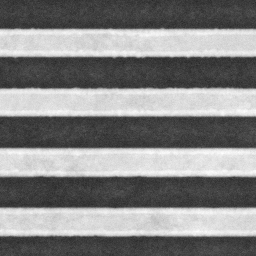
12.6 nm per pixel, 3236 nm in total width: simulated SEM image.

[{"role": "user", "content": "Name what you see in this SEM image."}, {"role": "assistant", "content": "lines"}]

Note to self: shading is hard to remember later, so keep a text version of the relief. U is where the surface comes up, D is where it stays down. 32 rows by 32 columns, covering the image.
DDDDDDDDDDDDDDDDDDDDDDDDDDDDDDDD
DDDDDDDDDDDDDDDDDDDDDDDDDDDDDDDD
DDDDDDDDDDDDDDDDDDDDDDDDDDDDDDDD
DDDDDDDDDDDDDDDDDDDDDDDDDDDDDDDD
UUUUUUUUUUUUUUUUUUUUUUUUUUUUUUUU
UUUUUUUUUUUUUUUUUUUUUUUUUUUUUUUU
UUUUUUUUUUUUUUUUUUUUUUUUUUUUUUUU
DDDDDDDDDDDDDDDDDDDDDDDDDDDDDDDD
DDDDDDDDDDDDDDDDDDDDDDDDDDDDDDDD
DDDDDDDDDDDDDDDDDDDDDDDDDDDDDDDD
DDDDDDDDDDDDDDDDDDDDDDDDDDDDDDDD
UUUUUUUUUUUUUUUUUUUUUUUUUUUUUUUU
UUUUUUUUUUUUUUUUUUUUUUUUUUUUUUUU
UUUUUUUUUUUUUUUUUUUUUUUUUUUUUUUU
DDDDDDDDDDDDDDDDDDDDDDDDDDDDDDDD
DDDDDDDDDDDDDDDDDDDDDDDDDDDDDDDD
DDDDDDDDDDDDDDDDDDDDDDDDDDDDDDDD
DDDDDDDDDDDDDDDDDDDDDDDDDDDDDDDD
DDDDDDDDDDDDDDDDDDDDDDDDDDDDDDDD
UUUUUUUUUUUUUUUUUUUUUUUUUUUUUUUU
UUUUUUUUUUUUUUUUUUUUUUUUUUUUUUUU
UUUUUUUUUUUUUUUUUUUUUUUUUUUUUUUU
DDDDDDDDDDDDDDDDDDDDDDDDDDDDDDDD
DDDDDDDDDDDDDDDDDDDDDDDDDDDDDDDD
DDDDDDDDDDDDDDDDDDDDDDDDDDDDDDDD
DDDDDDDDDDDDDDDDDDDDDDDDDDDDDDDD
UUUUUUUUUUUUUUUUUUUUUUUUUUUUUUUU
UUUUUUUUUUUUUUUUUUUUUUUUUUUUUUUU
UUUUUUUUUUUUUUUUUUUUUUUUUUUUUUUU
DDDDDDDDDDDDDDDDDDDDDDDDDDDDDDDD
DDDDDDDDDDDDDDDDDDDDDDDDDDDDDDDD
DDDDDDDDDDDDDDDDDDDDDDDDDDDDDDDD